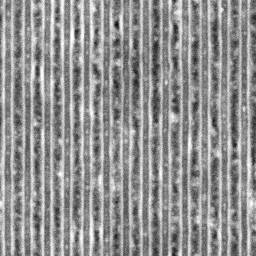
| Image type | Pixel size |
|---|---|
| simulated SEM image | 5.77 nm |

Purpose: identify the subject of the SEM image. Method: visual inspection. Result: parallel lines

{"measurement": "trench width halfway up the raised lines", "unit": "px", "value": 6.74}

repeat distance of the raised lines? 19.7 px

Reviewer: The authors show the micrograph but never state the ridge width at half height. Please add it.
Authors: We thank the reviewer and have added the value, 0.0721 µm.